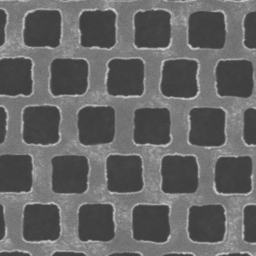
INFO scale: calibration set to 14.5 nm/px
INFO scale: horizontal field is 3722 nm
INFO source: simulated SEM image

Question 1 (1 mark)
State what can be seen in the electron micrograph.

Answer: a regular array of holes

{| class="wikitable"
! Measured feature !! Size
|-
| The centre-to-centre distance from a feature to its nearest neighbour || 0.793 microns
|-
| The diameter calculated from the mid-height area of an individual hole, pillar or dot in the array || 593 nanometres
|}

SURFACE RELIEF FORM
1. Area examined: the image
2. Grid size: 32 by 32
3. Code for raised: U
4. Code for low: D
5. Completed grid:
UUUUUUUUUUUUUUUUUUUUUUUUUUUUUUUU
DUUUDDDUUUUDDDUUUDDDDUUUDDDUUUUD
DUUDDDDDUUDDDDUUUDDDDUUUDDDDUUDD
DUUDDDDDUUDDDDUUUDDDDUUDDDDDUUDD
DUUDDDDDUUDDDDDUUDDDDUUDDDDDUUUD
UUUDDDDUUUDDDDUUUDDDDUUUDDDDUUUD
UUUUUUUUUUUUUUUUUUUUUUUUUUUUUUUU
DDDDUUUDDDDUUUDDDDUUUDDUUUUUUDDU
DDDDUUDDDDDUUUDDDDUUDDDDDUUDDDDD
DDDDUUDDDDDUUDDDDDUUDDDDDUUDDDDD
DDDDUUDDDDDUUDDDDDUUDDDDDUUDDDDD
DDDDUUDDDDDUUUDDDDUUDDDDDUUDDDDD
UUUUUUUUUUUUUUUUUUUUUUUUUUUUUUUU
UUUDDDDUUUDDDDUUUUDDDUUUDDUUUUUU
DUUDDDDDUUDDDDUUUDDDDUUUDDDDUUDD
DUUDDDDUUUDDDDUUUDDDDUUUDDDDUUDD
DUUDDDDUUUDDDDUUUDDDDUUUDDDDUUDD
DUUDDDDUUUDDDDUUUDDDDUUUDDDDUUUD
UUUUUUUUUUUUUUUUUUUUUUUUUUUUUUUU
DDDDUUUDDDUUUUDDDUUUUDDDUUUUUUUU
DDDDUUDDDDDUUDDDDDUUDDDDDUUDDDDD
DDDDUUUDDDDUUDDDDDUUDDDDDUUDDDDD
DDDDUUUDDDDUUDDDDDUUDDDDDUUDDDDU
DDDDUUUDDDDUUDDDDDUUDDDDDUUDDDDU
UUUUUUUUUUUUUUUUUUUUUUUUUUUUUUUU
UUUUDDDUUUUUDUUUUUUUUUUUUUDUUUUU
DUUDDDDUUUDDDDUUUDDDDUUUDDDDUUDD
DUUDDDDDUUDDDDUUUDDDDUUUDDDDUUDD
DUUDDDDDUUDDDDUUUDDDDUUDDDDDUUDD
DUUDDDDUUUDDDDUUUDDDDUUUDDDDUUDD
UUUUUUUUUUUUUUUUUUUUUUUUUUUUUUUU
UDDUUUUDDUUUUUUUUUUUUUUUUUUUUUUU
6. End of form